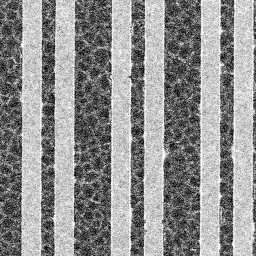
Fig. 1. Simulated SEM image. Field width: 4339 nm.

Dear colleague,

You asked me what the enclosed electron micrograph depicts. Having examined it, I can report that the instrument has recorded parallel lines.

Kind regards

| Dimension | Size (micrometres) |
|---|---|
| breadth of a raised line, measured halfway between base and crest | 0.311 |